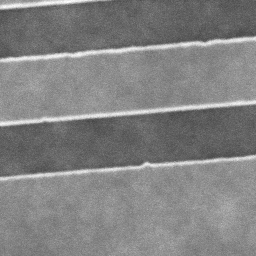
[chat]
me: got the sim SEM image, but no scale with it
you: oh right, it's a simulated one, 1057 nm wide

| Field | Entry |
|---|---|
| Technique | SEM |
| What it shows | one or a few lines or trenches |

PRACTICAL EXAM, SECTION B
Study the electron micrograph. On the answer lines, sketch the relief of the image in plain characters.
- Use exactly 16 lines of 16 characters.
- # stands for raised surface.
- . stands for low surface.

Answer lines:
................
................
...............#
...#############
################
################
###############.
###.............
................
................
........########
################
################
################
################
################